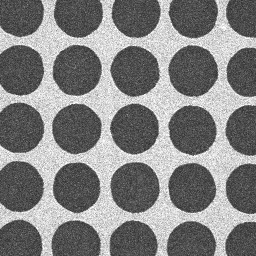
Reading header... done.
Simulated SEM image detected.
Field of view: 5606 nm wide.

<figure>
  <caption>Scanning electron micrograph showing a regular array of holes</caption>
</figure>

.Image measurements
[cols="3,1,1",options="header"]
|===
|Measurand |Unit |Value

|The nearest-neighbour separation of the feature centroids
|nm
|1260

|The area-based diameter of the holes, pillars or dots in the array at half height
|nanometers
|1090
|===